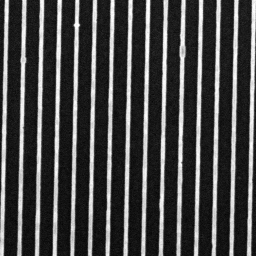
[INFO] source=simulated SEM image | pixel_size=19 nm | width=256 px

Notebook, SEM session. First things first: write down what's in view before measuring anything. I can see parallel lines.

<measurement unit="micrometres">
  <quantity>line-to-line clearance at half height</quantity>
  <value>0.281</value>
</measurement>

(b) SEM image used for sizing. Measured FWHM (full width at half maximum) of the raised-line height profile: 57.1 nanometers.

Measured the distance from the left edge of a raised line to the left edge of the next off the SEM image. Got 336 nm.